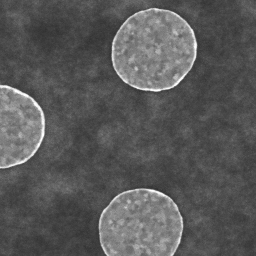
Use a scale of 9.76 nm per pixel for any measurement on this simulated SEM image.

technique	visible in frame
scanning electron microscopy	raised bodies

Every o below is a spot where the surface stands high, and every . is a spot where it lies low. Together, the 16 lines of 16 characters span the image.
................
........oooo....
.......ooooo....
.......ooooo....
.......ooooo....
o........oo.....
oo..............
ooo.............
ooo.............
oo..............
................
................
.......oooo.....
......ooooo.....
......ooooo.....
......ooooo.....